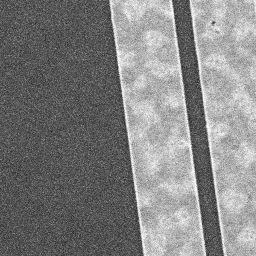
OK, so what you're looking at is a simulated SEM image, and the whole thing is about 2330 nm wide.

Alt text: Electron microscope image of one or a few lines or trenches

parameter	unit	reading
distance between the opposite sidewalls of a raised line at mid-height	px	60.7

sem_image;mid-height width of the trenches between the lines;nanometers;171